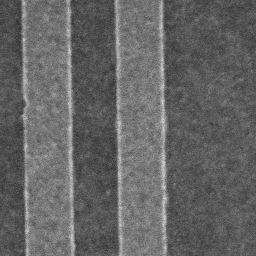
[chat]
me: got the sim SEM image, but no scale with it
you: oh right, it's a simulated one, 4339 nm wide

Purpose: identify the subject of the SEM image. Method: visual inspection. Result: one or a few lines or trenches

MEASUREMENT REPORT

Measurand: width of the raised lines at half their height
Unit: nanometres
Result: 773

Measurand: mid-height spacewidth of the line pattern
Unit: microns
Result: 0.803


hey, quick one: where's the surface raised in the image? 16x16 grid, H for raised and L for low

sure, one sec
LHHHLLLHHHLLLLLL
LHHHLLLHHHLLLLLL
LHHHLLLHHHLLLLLL
LHHHLLLHHHLLLLLL
LLHHLLLHHHLLLLLH
LLHHLLLHHHLLLLLL
LLHHLLLHHHLLLLLL
LLHHLLLHHHLLLLLL
LLHHLLLHHHLLLLLL
LLHHLLLHHHLLLLLL
LLHHLLLHHHLLLLLL
LLHHLLLHHHLLLLLL
LLHHHLLHHHLLLLLL
LLHHHLLHHHLLLLLL
LLHHHLLHHHLLLLLL
LLHHHLLLHHLLLLLL